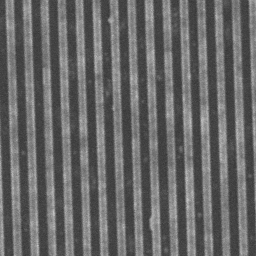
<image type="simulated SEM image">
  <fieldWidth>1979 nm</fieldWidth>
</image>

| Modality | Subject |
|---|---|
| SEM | parallel lines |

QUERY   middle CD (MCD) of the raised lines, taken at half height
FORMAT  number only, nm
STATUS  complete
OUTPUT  54.1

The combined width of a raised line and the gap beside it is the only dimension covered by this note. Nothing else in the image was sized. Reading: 17.4 pixels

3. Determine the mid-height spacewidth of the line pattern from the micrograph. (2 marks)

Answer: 85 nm